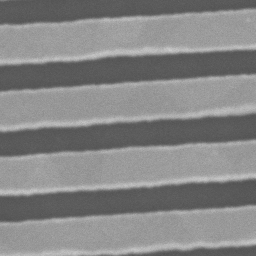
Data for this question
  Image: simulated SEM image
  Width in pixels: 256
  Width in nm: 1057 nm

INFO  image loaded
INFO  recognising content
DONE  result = lines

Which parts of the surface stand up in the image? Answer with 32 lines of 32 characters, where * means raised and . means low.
................................
...........................*****
..........**********************
********************************
********************************
********************************
************************........
**********......................
................................
..............................**
...............*****************
.*******************************
********************************
********************************
*************************.......
************....................
................................
................................
................****************
...*****************************
********************************
********************************
*****************************...
****************................
................................
................................
.....................***********
......**************************
********************************
********************************
********************************
******************..............